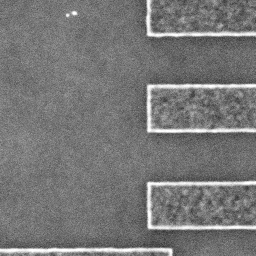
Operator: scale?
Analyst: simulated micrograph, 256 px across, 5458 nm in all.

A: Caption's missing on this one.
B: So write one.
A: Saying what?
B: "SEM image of wiring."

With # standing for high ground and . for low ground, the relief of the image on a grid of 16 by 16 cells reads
.........#######
.........#######
................
................
................
.........#######
.........#######
.........#######
................
................
................
..........######
.........#######
.........#######
................
................